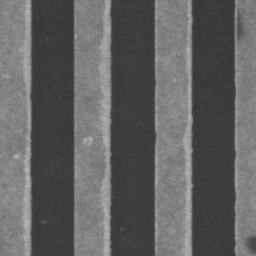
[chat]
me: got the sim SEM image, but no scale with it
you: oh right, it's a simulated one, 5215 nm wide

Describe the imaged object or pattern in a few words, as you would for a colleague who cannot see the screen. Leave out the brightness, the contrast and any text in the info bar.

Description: lines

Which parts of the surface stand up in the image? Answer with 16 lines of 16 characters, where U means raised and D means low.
UUDDDUUDDDUUDDDU
UUDDDUUDDDUUDDDU
UUDDDUUDDDUUDDDU
UUDDDUUDDDUUDDDU
UUDDDUUDDDUUDDDU
UUDDDUUDDDUUDDDU
UUDDDUUDDDUUDDDU
UUDDDUUDDDUUDDDU
UUDDDUUDDDUUDDDU
UUDDDUUDDDUUDDDU
UUDDDUUDDDUUDDDU
UUDDDUUDDDUUDDDU
UUDDDUUDDDUUDDDU
UUDDDUUDDDUUDDDU
UUDDDUUDDDUUDDDU
UUDDDUUDDDUUDDDU